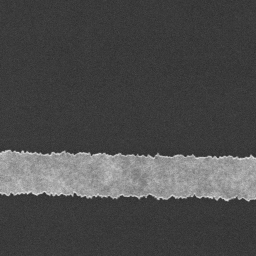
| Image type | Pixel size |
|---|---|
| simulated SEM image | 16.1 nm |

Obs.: one or a few lines or trenches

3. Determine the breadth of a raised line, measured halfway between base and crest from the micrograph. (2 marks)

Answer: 0.648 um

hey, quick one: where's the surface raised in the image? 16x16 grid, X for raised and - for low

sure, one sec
----------------
----------------
----------------
----------------
----------------
----------------
----------------
----------------
----------------
X---------------
XXXXXXXXXXXXXXXX
XXXXXXXXXXXXXXXX
----------------
----------------
----------------
----------------